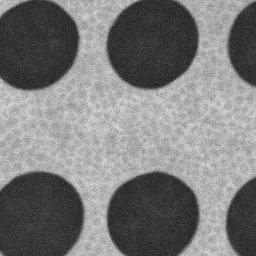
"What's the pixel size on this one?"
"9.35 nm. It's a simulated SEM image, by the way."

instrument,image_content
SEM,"holes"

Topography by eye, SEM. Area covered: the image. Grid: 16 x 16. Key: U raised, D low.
UDDDUUUUDDDDUUUD
DDDDDUUDDDDDUUUD
DDDDDUUDDDDDUUDD
DDDDDUUDDDDDUUDD
DDDDUUUDDDDDUUUD
UDDUUUUUUDUUUUUU
UUUUUUUUUUUUUUUU
UUUUUUUUUUUUUUUU
UUUUUUUUUUUUUUUU
UUUUUUUUUUUUUUUU
UUUUUUUUUUUUUUUU
DDDDUUUUDDDDUUUD
DDDDDUUDDDDDUUUD
DDDDDUUDDDDDUUDD
DDDDDUUDDDDDUUDD
DDDDDUUDDDDDUUUD